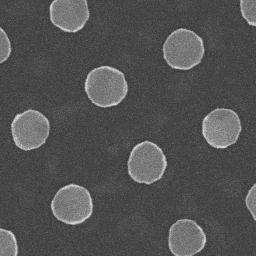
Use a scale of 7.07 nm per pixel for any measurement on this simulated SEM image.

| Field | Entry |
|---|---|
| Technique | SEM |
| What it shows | raised bodies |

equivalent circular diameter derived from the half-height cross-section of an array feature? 277 nm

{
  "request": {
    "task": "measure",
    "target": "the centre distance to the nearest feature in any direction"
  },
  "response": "603 nm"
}